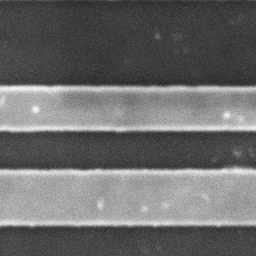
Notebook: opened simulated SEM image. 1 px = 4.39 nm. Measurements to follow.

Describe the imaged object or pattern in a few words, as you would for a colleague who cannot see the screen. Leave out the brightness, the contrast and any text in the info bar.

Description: lines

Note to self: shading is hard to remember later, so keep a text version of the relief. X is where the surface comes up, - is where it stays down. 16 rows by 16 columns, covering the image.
----------------
----------------
----------------
----------------
----------------
XXXXXXXXXXXXXXXX
XXXXXXXXXXXXXXXX
XXXXXXXXXXXXXXXX
----------------
----------------
----------------
XXXXXXXXXXXXXXXX
XXXXXXXXXXXXXXXX
XXXXXXXXXXXXXXXX
----------------
----------------